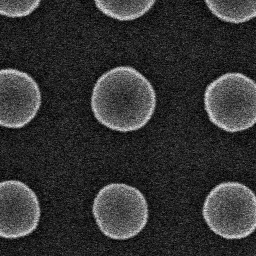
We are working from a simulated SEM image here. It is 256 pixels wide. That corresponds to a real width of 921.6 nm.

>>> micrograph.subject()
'raised bodies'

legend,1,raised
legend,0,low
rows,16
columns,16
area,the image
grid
1100001110000111
0000000000000000
0000000000000000
0000000000000000
1000000100000000
1100001110000111
1100001111000111
1100001110000111
0000000000000000
0000000000000000
0000000000000000
1000000000000000
1100001110000111
1100001110000111
1100000110000011
0000000000000000